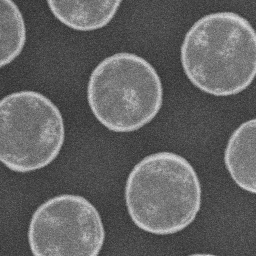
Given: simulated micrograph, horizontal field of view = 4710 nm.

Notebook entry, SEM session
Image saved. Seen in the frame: raised bodies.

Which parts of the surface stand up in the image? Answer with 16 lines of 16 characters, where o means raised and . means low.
o..oooo.........
o...oo......ooo.
o...........oooo
o..........ooooo
......oooo..oooo
......oooo...oo.
ooo...oooo......
oooo..ooo.......
oooo...........o
oooo..........oo
.o.......ooo..oo
........oooo...o
...oo...oooo....
..oooo..oooo....
..oooo..........
..oooo..........